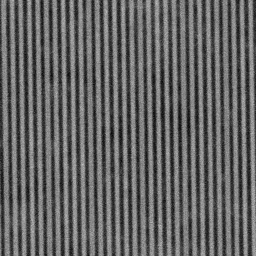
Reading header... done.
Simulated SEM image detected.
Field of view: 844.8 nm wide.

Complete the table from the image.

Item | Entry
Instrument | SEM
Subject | parallel lines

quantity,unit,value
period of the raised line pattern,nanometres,28.1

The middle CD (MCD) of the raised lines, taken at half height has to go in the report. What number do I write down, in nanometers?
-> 13.2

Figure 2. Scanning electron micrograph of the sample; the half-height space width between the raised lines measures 15.3 nanometers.